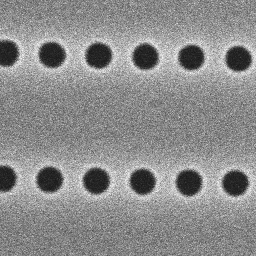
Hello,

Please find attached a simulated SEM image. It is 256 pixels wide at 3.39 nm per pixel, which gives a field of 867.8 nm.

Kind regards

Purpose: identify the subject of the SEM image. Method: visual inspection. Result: a regular array of holes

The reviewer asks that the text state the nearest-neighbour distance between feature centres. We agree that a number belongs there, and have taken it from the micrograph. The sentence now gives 0.157 µm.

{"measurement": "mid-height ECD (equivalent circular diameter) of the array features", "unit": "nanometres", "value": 93.2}